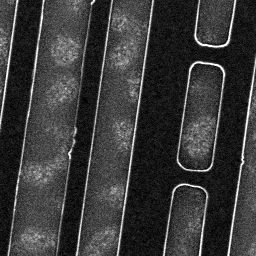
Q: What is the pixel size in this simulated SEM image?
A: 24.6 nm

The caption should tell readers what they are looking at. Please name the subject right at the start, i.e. one or a few lines or trenches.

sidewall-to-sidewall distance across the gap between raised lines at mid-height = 992 nm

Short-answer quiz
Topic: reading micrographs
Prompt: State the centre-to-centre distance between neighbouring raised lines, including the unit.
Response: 1.79 microns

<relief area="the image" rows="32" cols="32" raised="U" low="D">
DDUUUDDDDDDUUUDDDDDUUUUUUDDDDUUU
DDUUUDDDDDDUUUDDDDDUUUUUUDDDDUUU
DDUUUDDDDDDUUUDDDDDUUUUUUDDDDUUU
DDUUUDDDDDDUUUDDDDDUUUUUUDDDDUUU
DDUUUDDDDDDUUDDDDDDUUUUUDDDDDUUU
DUUUUDDDDDDUUDDDDDUUUUUUUDDDUUUU
DUUUUDDDDDUUUDDDDDUUUUUUUUUUUUUU
DUUUUDDDDDUUUDDDDDUUUUUUUUUUUUUU
DUUUDDDDDDUUUDDDDDUUUUUUDDDDUUUU
DUUUDDDDDDUUUDDDDDUUUUUUDDDDUUUU
DUUUDDDDDDUUUDDDDDUUUUUUDDDDUUUU
DUUUDDDDDDUUDDDDDDUUUUUDDDDDUUUD
UUUUDDDDDDUUDDDDDUUUUUUDDDDDUUUD
UUUUDDDDDDUUDDDDDUUUUUUDDDDUUUUD
UUUUDDDDDUUUDDDDDUUUUUUDDDDUUUUD
UUUDDDDDDUUUDDDDDUUUUUUDDDDUUUUD
UUUDDDDDDUUUDDDDDUUUUUUDDDDUUUUD
UUUDDDDDDUUUDDDDDUUUUUUDDDDUUUUD
UUUDDDDDDUUUDDDDDUUUUUDDDDDUUUDD
UUUDDDDDDUUDDDDDUUUUUUDDDDDUUUDD
UUUDDDDDDUUDDDDDUUUUUUDDDDUUUUDD
UUDDDDDDUUUDDDDDUUUUUUUUUUUUUUDD
UUDDDDDDUUUDDDDDUUUUUUUUUUUUUUDD
UUDDDDDDUUUDDDDDUUUUUUDDDUUUUUDD
UUDDDDDDUUUDDDDDUUUUUUDDDDUUUUDD
UUDDDDDDUUUDDDDDUUUUUDDDDDUUUDDD
UUDDDDDDUUDDDDDUUUUUUDDDDDUUUDDD
UUDDDDDDUUDDDDDUUUUUUDDDDUUUUDDD
UUDDDDDUUUDDDDDUUUUUUDDDDUUUUDDD
UDDDDDDUUUDDDDDUUUUUUDDDDUUUUDDD
UDDDDDDUUUDDDDDUUUUUUDDDDUUUUDDD
UDDDDDDUUUDDDDDUUUUUUDDDDUUUUDDD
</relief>